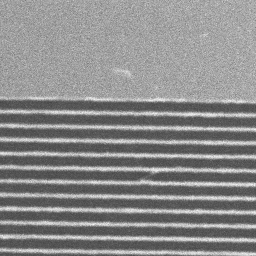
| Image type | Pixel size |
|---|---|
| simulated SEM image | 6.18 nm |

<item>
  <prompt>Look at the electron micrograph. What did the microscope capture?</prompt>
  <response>parallel lines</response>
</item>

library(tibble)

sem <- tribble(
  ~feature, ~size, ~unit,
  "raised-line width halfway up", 0.0301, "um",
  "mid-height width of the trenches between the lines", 54.8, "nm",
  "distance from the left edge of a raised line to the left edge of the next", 85.8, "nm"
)